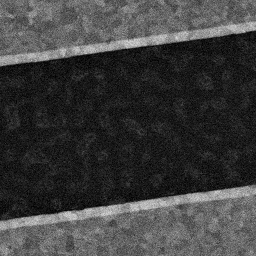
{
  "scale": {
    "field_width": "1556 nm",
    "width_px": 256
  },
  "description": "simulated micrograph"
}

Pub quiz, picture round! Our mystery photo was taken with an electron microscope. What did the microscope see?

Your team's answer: one or a few lines or trenches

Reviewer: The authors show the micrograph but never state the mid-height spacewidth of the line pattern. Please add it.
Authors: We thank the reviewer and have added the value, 988 nanometres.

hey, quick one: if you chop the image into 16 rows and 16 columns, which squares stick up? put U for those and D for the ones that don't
UUUUUUUUUUUUUUUU
UUUUUUUUUUUUUUUU
UUUUUUUUUUDDDDDD
UUUDDDDDDDDDDDDD
DDDDDDDDDDDDDDDD
DDDDDDDDDDDDDDDD
DDDDDDDDDDDDDDDD
DDDDDDDDDDDDDDDD
DDDDDDDDDDDDDDDD
DDDDDDDDDDDDDDDD
DDDDDDDDDDDDDDDD
DDDDDDDDDDDDDDDD
DDDDDDDDDDDUUUUU
DDDDDUUUUUUUUUUU
UUUUUUUUUUUUUUUU
UUUUUUUUUUUUUUUU